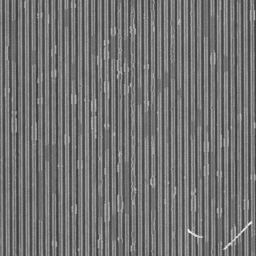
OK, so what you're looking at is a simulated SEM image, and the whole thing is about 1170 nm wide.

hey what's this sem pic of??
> parallel lines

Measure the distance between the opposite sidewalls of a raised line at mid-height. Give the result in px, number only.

3.5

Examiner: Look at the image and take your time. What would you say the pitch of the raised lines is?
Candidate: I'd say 30.3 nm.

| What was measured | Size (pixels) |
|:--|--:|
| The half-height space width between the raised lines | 3.37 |